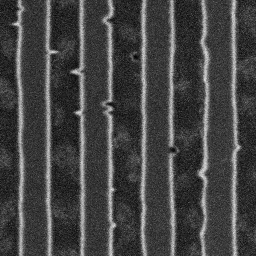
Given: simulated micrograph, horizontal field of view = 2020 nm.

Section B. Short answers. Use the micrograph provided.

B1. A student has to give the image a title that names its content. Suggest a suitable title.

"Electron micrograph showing one or a few lines or trenches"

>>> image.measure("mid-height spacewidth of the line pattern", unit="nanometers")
258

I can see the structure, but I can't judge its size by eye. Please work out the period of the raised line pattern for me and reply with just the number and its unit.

487 nm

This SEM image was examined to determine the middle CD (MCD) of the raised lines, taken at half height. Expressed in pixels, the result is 28.9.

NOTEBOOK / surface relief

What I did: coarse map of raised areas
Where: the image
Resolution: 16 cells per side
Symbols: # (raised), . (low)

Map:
.##..##..##..##.
.##..##..##..##.
.##..##..##..##.
.##..##..##..##.
.##..##..##..##.
.##..##..##..##.
.##..##..##..##.
.##..##..##..##.
.##..##..##..##.
.##..##..##..##.
.##..##..##..##.
.##..##..##..##.
.##..##..##..##.
.##..##..##..##.
.##..##..##..##.
.##..##..##..##.